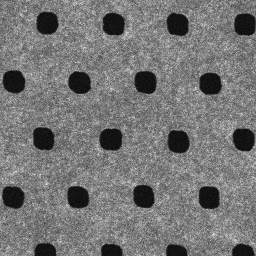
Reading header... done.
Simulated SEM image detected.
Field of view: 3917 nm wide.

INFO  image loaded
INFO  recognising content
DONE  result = a regular array of holes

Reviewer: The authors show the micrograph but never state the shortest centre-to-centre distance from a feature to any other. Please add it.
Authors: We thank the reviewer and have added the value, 989 nanometers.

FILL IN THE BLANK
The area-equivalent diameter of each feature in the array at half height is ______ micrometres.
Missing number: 0.357